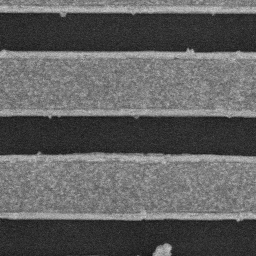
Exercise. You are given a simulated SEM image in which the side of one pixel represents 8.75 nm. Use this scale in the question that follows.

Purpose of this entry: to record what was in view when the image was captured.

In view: one or a few lines or trenches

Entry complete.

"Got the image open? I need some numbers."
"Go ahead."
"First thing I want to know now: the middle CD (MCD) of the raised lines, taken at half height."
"513 nm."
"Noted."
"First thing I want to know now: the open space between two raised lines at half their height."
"0.394 micrometres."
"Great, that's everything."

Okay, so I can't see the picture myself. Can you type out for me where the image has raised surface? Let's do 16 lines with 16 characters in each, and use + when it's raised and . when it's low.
+++++++++++.++++
................
................
++..++..++++++++
++++++++++++++++
++++++++++++++++
++++++++++++++++
................
................
................
++++++++++++++++
++++++++++++++++
++++++++++++++++
++....+++..+++++
................
..........+.....